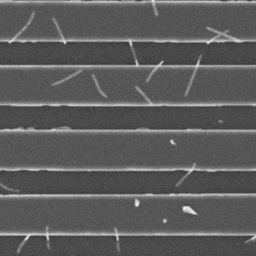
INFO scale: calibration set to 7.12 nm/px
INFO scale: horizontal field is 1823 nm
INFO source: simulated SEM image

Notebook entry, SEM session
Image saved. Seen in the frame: lines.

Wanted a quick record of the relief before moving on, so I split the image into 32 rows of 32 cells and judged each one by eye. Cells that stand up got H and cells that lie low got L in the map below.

HHHHHHHHHHHHHHHHHHHHHHHHHHHHHHHH
HHHHHHHHHHHHHHHHHHHHHHHHHHHHHHHH
HHHHHHHHHHHHHHHHHHHHHHHHHHHHHHHH
HHHHHHHHHHHHHHHHHHHHHHHHHHHHHHHH
HHHHHHHHHHHHHHHHHHHHHHHHHHHHHHHH
LLLLLLLLLLLLLLLLLLLLLLLLLLLLLLLL
LLLLLLLLLLLLLLLLLLLLLLLLLLLLLLLL
LLLLLLLLLLLLLLLLLLLLLLLLLLLLLLLL
HHHHHHHHHHHHHHHHHHHHHHHHHHHHHHHH
HHHHHHHHHHHHHHHHHHHHHHHHHHHHHHHH
HHHHHHHHHHHHHHHHHHHHHHHHHHHHHHHH
HHHHHHHHHHHHHHHHHHHHHHHHHHHHHHHH
HHHHHHHHHHHHHHHHHHHHHHHHHHHHHHHH
LLLLLLLLLLLLLLLLLLLLLLLLLLLLLLLL
LLLLLLLLLLLLLLLLLLLLLLLLLLLLLLLL
LLLLLLLLLLLLLLLLLLLLLLLLLLLLLLLL
HHHHHHHHHHHHHHHHHHHHHHHHHHHHHHHH
HHHHHHHHHHHHHHHHHHHHHHHHHHHHHHHH
HHHHHHHHHHHHHHHHHHHHHHHHHHHHHHHH
HHHHHHHHHHHHHHHHHHHHHHHHHHHHHHHH
HHHHHHHHHHHHHHHHHHHHHHHHHHHHHHHH
LLLLLLLLLLLLLLLLLLLLLLLLLLLLLLLL
LLLLLLLLLLLLLLLLLLLLLLLLLLLLLLLL
LLLLLLLLLLLLLLLLLLLLLLLLLLLLLLLL
HHHHHHHHHHHHHHHHHHHHHHHHHHHHHHHH
HHHHHHHHHHHHHHHHHHHHHHHHHHHHHHHH
HHHHHHHHHHHHHHHHHHHHHHHHHHHHHHHH
HHHHHHHHHHHHHHHHHHHHHHHHHHHHHHHH
HHHHHHHHHHHHHHHHHHHHHHHHHHHHHHHH
LLLLLLLLLLLLLLLLLLLLLLLLLLLLLLLL
LLLLLLLLLLLLLLLLLLLLLLLLLLLLLLLL
LLLLLLLLLLLLLLLLLLLLLLLLLLLLLLLL